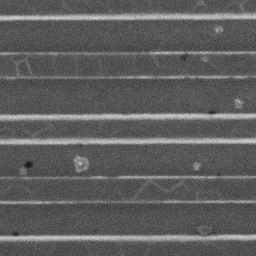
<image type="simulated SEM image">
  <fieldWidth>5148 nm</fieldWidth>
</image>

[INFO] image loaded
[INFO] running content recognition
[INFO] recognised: lines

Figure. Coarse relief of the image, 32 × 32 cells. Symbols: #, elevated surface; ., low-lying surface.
################################
################################
................................
................................
................................
................................
................................
################################
################################
################################
................................
................................
................................
................................
................................
################################
################################
################################
................................
................................
................................
................................
################################
################################
################################
................................
................................
................................
................................
................................
################################
################################